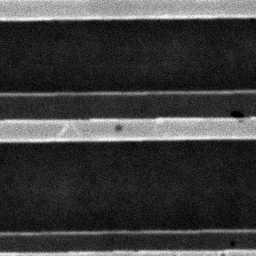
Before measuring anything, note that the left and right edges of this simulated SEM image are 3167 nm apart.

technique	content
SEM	lines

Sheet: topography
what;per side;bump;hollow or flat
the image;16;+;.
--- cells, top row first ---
++++++++++++++++
................
................
................
................
................
++++++++++++++++
++++++++++++++++
++++++++++++++++
................
................
................
................
................
...........+++++
++++++++++++++++